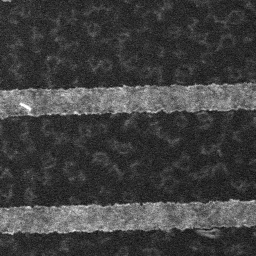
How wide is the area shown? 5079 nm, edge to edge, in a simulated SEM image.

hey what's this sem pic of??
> one or a few lines or trenches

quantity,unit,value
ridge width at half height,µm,0.496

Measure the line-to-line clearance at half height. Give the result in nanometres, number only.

1820